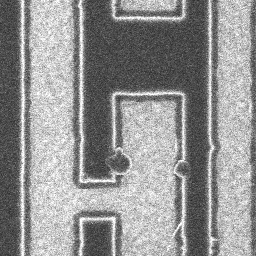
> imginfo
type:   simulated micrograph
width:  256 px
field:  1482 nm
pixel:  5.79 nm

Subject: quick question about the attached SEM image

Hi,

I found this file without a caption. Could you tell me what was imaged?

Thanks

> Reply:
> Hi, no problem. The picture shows one or a few lines or trenches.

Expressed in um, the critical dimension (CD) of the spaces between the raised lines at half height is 0.336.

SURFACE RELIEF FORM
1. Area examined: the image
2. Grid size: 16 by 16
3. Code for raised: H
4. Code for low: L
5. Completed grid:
HLLLLHHLLLLHHLLL
HLLLLHHHHHHHHLLL
HLLLLHHHHHHHHLLL
HLLLLHHHHHHHHLLL
HLLLLHHHHHHHHLLL
HLLLLHHHHHHHHLLL
HLLLLHHLLLLHHLLL
HLLLLHHLLLLHHLLL
HLLLLHHLLLLHHLLL
HLLLLHHHLLLHHLLL
HLLLLHHHLLLHHLLL
HLLLLLLLLLLHHLLL
HLLLLLLLLLLHHLLL
HLLLLLLLLLLHHLLL
HLLLLHHLLLLHHLLL
HLLLLHHLLLLHHLLL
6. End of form